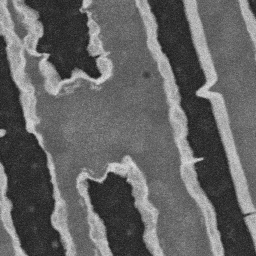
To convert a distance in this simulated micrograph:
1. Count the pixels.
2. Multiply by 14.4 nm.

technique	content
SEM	one or a few lines or trenches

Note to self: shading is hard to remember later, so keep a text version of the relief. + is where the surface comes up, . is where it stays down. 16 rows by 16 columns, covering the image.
+....++++...+++.
++....+++...++++
.+....+++...++++
.++....+++...+++
.++....+++...+++
..+++++++++..+++
..+++++++++...++
..+++++++++...++
..+++++++++...++
...++++++++...++
...++++.++++...+
....+....+++...+
....+....++++..+
....++...++++...
+...++....+++...
+...+++...++++..